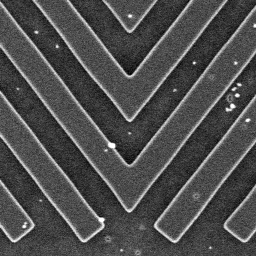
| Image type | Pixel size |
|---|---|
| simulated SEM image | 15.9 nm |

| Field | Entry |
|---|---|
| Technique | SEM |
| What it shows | groups of lines, slits or small figures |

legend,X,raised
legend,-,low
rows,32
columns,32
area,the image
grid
----XXXXX----XXXXXX----XXXXX----
X----XXXXX----XXXXX----XXXX----X
XX----XXXX-----XXX----XXXX-----X
XXX----XXXX-----X----XXXXX----XX
XXX-----XXXX--------XXXXX----XXX
XXXX----XXXXX-------XXXX----XXXX
XXXXX----XXXXX-----XXXX----XXXXX
-XXXXX----XXXX----XXXXX----XXXX-
--XXXXX----XXXX--XXXXX----XXXXX-
---XXXX----XXXXXXXXXX----XXXXX--
----XXXX----XXXXXXXX----XXXXX---
----XXXXX----XXXXXX-----XXXX----
X----XXXXX----XXXXX----XXXX----X
XX----XXXX-----XXX----XXXX-----X
XX-----XXXX----XX----XXXXX----XX
XXX----XXXXX--------XXXXX----XXX
XXXX----XXXXX-------XXXX----XXXX
XXXXX----XXXX------XXXX-----XXXX
-XXXXX----XXXX----XXXXX----XXXX-
--XXXX-----XXXX--XXXXX----XXXXX-
---XXXX----XXXXXXXXXX----XXXXX--
----XXXX----XXXXXXXX----XXXXX---
----XXXXX----XXXXXX-----XXXX----
X----XXXX-----XXXXX----XXXX-----
XX----XXXX-----XXX----XXXXX----X
XX-----XXXX----XX----XXXXX----XX
XXX----XXXXX--------XXXXX----XXX
XXXX----XXXXX-------XXXX----XXXX
XXXX-----XXXX------XXXXX----XXXX
-XX-------XX---------XX------XX-
--------------------------------
--------------------------------